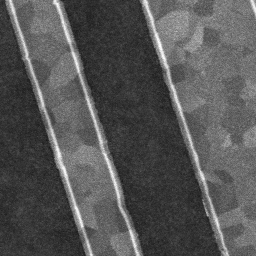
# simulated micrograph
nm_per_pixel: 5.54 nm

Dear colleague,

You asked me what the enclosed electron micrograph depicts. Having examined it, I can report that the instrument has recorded one or a few lines or trenches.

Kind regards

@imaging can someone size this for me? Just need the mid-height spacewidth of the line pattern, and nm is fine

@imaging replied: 472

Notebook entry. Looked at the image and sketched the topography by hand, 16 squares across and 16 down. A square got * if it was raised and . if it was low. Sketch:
.***.....*******
.***......******
.***......******
..***.....******
..***.....******
..***......*****
...***.....*****
...***.....*****
...***......****
....***.....****
....***.....****
....***......***
.....**......***
.....***.....***
.....***......**
......**......**